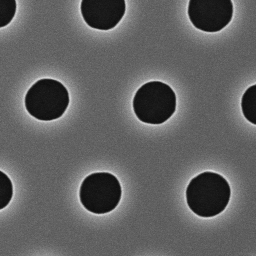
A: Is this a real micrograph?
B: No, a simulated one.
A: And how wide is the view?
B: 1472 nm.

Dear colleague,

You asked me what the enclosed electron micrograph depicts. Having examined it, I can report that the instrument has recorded holes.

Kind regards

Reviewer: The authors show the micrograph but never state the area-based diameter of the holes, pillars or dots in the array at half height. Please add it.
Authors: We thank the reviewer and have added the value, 0.25 um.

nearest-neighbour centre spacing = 606 nm